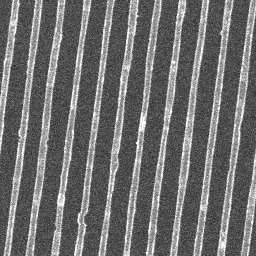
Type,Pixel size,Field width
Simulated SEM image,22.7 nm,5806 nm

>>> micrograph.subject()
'parallel lines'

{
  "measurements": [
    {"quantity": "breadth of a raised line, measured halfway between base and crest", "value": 155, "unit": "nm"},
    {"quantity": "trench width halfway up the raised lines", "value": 399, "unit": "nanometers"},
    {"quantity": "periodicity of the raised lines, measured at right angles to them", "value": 535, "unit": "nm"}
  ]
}